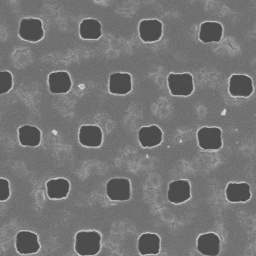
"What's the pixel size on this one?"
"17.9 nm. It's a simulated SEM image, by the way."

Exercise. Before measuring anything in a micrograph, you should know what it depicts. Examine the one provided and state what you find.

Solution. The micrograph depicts a regular array of holes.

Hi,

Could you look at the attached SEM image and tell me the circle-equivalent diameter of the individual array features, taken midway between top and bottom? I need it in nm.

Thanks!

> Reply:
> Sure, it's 405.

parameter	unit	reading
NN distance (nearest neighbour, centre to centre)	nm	1070